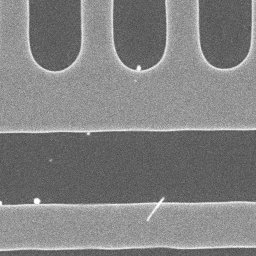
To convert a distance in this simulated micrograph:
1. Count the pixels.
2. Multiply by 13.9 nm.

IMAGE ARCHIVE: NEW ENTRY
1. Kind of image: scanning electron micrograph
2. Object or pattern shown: groups of lines, slits or small figures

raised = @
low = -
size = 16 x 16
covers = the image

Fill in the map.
@@---@@---@@----
@@---@@---@@----
@@---@@---@@----
@@---@@---@@@--@
@@@@@@@@@@@@@@@@
@@@@@@@@@@@@@@@@
@@@@@@@@@@@@@@@@
@@@@@@@@@@@@@@@@
----------------
----------------
----------------
----------------
----------------
@@@@@@@@@@@@@@@@
@@@@@@@@@@@@@@@@
@@@@@@@@---@@---